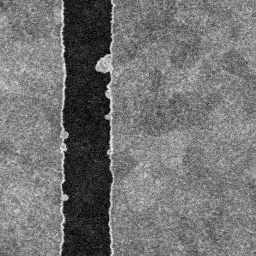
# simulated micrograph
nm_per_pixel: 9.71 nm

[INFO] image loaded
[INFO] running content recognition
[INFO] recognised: one or a few lines or trenches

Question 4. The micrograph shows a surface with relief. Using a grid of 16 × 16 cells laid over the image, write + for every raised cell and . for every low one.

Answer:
++++...+++++++++
++++...+++++++++
++++...+++++++++
++++...+++++++++
++++...+++++++++
++++...+++++++++
++++...+++++++++
++++...+++++++++
++++...+++++++++
++++...+++++++++
++++...+++++++++
++++...+++++++++
++++...+++++++++
++++...+++++++++
++++...+++++++++
++++...+++++++++